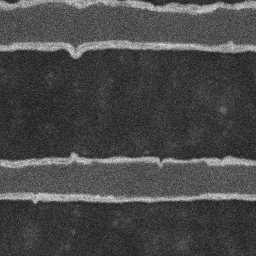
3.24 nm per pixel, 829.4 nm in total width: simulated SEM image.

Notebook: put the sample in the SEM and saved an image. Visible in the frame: one or a few lines or trenches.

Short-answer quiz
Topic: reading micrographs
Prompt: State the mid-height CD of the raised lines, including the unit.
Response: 134 nm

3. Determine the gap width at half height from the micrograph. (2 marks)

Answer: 361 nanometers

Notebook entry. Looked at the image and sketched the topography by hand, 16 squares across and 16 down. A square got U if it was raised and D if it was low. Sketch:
UUUUUUUUUUUDUUUU
UUUUUUUUUUUUUUUU
UUUUUUUUUUUUUUUU
DDDDDDDDDDDDDDDD
DDDDDDDDDDDDDDDD
DDDDDDDDDDDDDDDD
DDDDDDDDDDDDDDDD
DDDDDDDDDDDDDDDD
DDDDDDDDDDDDDDDD
DDDDDDDDDDDDDDDD
UUUUUUUUUUUUUUUU
UUUUUUUUUUUUUUUU
DDUDUUUUDDDDDDDD
DDDDDDDDDDDDDDDD
DDDDDDDDDDDDDDDD
DDDDDDDDDDDDDDDD